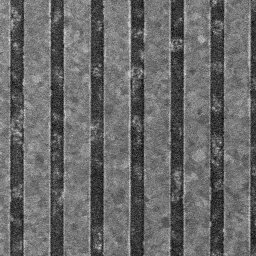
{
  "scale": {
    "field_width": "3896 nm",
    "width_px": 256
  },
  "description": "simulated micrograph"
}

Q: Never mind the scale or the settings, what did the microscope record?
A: parallel lines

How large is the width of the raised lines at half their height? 394 nanometres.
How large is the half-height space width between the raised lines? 209 nm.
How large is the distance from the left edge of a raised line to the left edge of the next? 0.608 µm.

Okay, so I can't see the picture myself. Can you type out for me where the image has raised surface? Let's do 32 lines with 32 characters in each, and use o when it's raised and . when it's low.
o..ooo..ooo..ooo..ooo..ooo..ooo.
o..ooo..ooo..ooo..ooo..ooo..ooo.
o..ooo..ooo..ooo..ooo..ooo..ooo.
o..ooo..ooo..ooo..ooo..ooo..ooo.
o..ooo..ooo..ooo..ooo..ooo..ooo.
o..ooo..ooo..ooo..ooo..ooo..ooo.
o..ooo..ooo..ooo..ooo..ooo..ooo.
o..ooo..ooo..ooo..ooo..ooo..ooo.
o..ooo..ooo..ooo..ooo..ooo..ooo.
o..ooo..ooo..ooo..ooo..ooo..ooo.
o..ooo..ooo..ooo..ooo..ooo..ooo.
o..ooo..ooo..ooo..ooo..ooo..ooo.
o..ooo..ooo..ooo..ooo..ooo..ooo.
o..ooo..ooo..ooo..ooo..ooo..ooo.
o..ooo..ooo..ooo..ooo..ooo..ooo.
o..ooo..ooo..ooo..ooo..ooo..ooo.
o..ooo..ooo..ooo..ooo..ooo..ooo.
o..ooo..ooo..ooo..ooo..ooo..ooo.
o..ooo..ooo..ooo..ooo..ooo..ooo.
o..ooo..ooo..ooo..ooo..ooo..ooo.
o..ooo..ooo..ooo..ooo..ooo..ooo.
o..ooo..ooo..ooo..ooo..ooo..ooo.
o..ooo..ooo..ooo..ooo..ooo..ooo.
o..ooo..ooo..ooo..ooo..ooo..ooo.
o..ooo..ooo..ooo..ooo..ooo..ooo.
o..ooo..ooo..ooo..ooo..ooo..ooo.
o..ooo..ooo..ooo..ooo..ooo..ooo.
o..ooo..ooo..ooo..ooo..ooo..ooo.
o..ooo..ooo..ooo..ooo..ooo..ooo.
o..ooo..ooo..ooo..ooo..ooo..ooo.
o..ooo..ooo..ooo..ooo..ooo..ooo.
o..ooo..ooo..ooo..ooo..ooo..ooo.